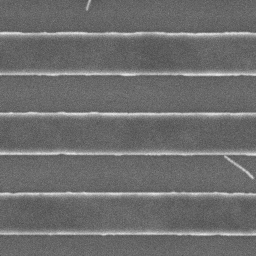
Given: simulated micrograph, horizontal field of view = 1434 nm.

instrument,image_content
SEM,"lines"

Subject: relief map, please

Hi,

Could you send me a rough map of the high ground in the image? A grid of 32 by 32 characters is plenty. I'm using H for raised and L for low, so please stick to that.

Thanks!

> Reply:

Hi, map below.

LLLLLLLLLLLLLLLLLLLLLLLLLLLLLLLL
LLLLLLLLLLLLLLLLLLLLLLLLLLLLLLLL
LLLLLLLLLLLLLLLLLLLLLLLLLLLLLLLL
LLLLLLLLLLLLLLLLLLLLLLLLLLLLLLLL
HHHHHHHHHHHHHHHHHHHHHHHHHHHHHHHH
HHHHHHHHHHHHHHHHHHHHHHHHHHHHHHHH
HHHHHHHHHHHHHHHHHHHHHHHHHHHHHHHH
HHHHHHHHHHHHHHHHHHHHHHHHHHHHHHHH
HHHHHHHHHHHHHHHHHHHHHHHHHHHHHHHH
LLLLLLLLLLLLLLLLLLLLLLLLLLLLLLLL
LLLLLLLLLLLLLLLLLLLLLLLLLLLLLLLL
LLLLLLLLLLLLLLLLLLLLLLLLLLLLLLLL
LLLLLLLLLLLLLLLLLLLLLLLLLLLLLLLL
LLLLLLLLLLLLLLLLLLLLLLLLLLLLLLLL
HHHHHHHHHHHHHHHHHHHHHHHHHHHHHHHH
HHHHHHHHHHHHHHHHHHHHHHHHHHHHHHHH
HHHHHHHHHHHHHHHHHHHHHHHHHHHHHHHH
HHHHHHHHHHHHHHHHHHHHHHHHHHHHHHHH
HHHHHHHHHHHHHHHHHHHHHHHHHHHHHHHH
LLLLLLLLLLLLLLLLLLLLLLLLLLLLLLLL
LLLLLLLLLLLLLLLLLLLLLLLLLLLLLLLL
LLLLLLLLLLLLLLLLLLLLLLLLLLLLLLLL
LLLLLLLLLLLLLLLLLLLLLLLLLLLLLLLL
LLLLLLLLLLLLLLLLLLLLLLLLLLLLLLLL
HHHHHHHHHHHHHHHHHHHHHHHHHHHHHHHH
HHHHHHHHHHHHHHHHHHHHHHHHHHHHHHHH
HHHHHHHHHHHHHHHHHHHHHHHHHHHHHHHH
HHHHHHHHHHHHHHHHHHHHHHHHHHHHHHHH
HHHHHHHHHHHHHHHHHHHHHHHHHHHHHHHH
LLLLLLLLLLLLLLLLLLLLLLLLLLLLLLLL
LLLLLLLLLLLLLLLLLLLLLLLLLLLLLLLL
LLLLLLLLLLLLLLLLLLLLLLLLLLLLLLLL